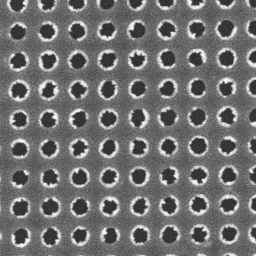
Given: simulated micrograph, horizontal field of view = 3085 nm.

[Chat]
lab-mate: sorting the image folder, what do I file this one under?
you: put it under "a regular array of holes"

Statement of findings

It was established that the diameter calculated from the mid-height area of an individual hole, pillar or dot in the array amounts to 177 nanometres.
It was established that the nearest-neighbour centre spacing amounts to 350 nm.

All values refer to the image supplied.